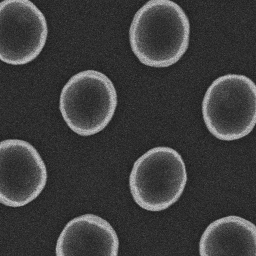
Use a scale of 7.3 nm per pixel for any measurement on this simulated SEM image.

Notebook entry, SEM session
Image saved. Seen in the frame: raised bodies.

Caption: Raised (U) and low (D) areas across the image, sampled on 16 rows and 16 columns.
UUDDDDDDDUUDDDDD
UUUDDDDDUUUUDDDD
UUUDDDDDUUUUDDDD
UUDDDDDDDUUDDDDD
DDDDDDDDDDDDDDDD
DDDDUUUDDDDDDUUU
DDDDUUUDDDDDDUUU
DDDDUUUDDDDDDUUU
DDDDDDDDDDDDDDUD
UUDDDDDDDUUDDDDD
UUUDDDDDUUUUDDDD
UUUDDDDDUUUDDDDD
UUDDDDDDDUUDDDDD
DDDDDDDDDDDDDDDD
DDDDUUUDDDDDDUUU
DDDDUUUDDDDDDUUU